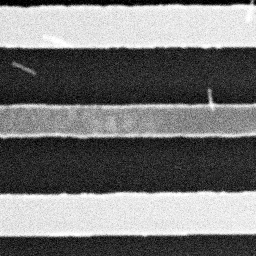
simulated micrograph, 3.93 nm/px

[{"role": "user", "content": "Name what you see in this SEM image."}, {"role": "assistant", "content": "lines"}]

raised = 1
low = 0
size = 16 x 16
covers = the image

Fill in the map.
1111111111111111
1111111111111111
1111111111111111
0000000000000000
0000000000000000
0000000000000000
0000000000000000
1111111111111111
1111111111111110
0000000000000000
0000000000000000
0000000000000000
1111111111111111
1111111111111111
1111111111111111
0000000000000000